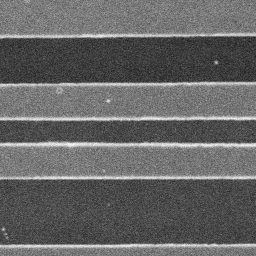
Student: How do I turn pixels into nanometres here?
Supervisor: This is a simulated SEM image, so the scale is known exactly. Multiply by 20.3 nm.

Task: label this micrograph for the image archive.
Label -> lines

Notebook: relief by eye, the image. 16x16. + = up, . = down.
++++++++++++++++
++++++++++++++++
................
................
................
++++++++++++++++
++++++++++++++++
++++++++++++++++
++++++++++++++++
++++++++++++++++
++++++++++++++++
................
................
................
................
++++++++++++++++